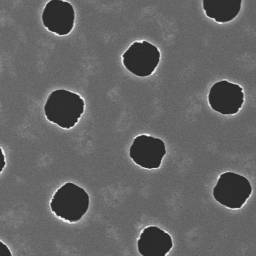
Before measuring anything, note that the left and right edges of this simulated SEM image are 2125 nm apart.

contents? holes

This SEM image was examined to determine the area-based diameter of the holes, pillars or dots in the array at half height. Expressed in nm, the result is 296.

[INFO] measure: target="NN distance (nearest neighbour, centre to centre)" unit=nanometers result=768